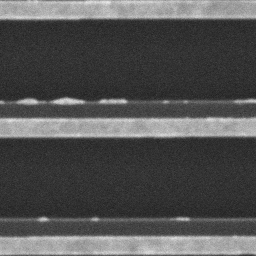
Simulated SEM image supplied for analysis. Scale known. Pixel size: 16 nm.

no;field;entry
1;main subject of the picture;lines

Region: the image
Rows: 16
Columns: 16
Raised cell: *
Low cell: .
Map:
****************
................
................
................
................
................
****************
****************
*************...
................
................
................
................
................
****************
****************